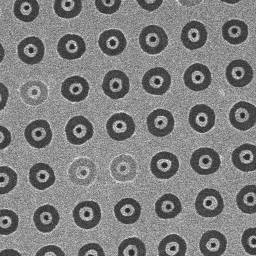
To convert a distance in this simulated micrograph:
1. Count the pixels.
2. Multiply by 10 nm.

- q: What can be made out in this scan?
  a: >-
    a regular array of ring-shaped grooves with a dot in the middle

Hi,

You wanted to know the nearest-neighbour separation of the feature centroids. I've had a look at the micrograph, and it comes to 408 nm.